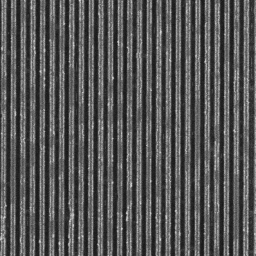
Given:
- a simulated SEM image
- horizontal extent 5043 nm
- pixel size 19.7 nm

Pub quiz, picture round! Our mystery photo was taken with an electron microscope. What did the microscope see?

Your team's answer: parallel lines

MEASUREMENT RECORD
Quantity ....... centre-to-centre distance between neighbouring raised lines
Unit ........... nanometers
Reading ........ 191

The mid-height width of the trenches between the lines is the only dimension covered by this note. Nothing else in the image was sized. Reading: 86.2 nanometres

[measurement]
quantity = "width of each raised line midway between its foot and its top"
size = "5.13 pixels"